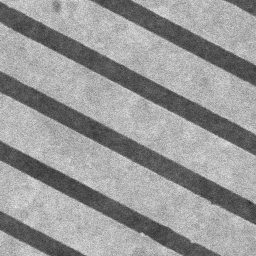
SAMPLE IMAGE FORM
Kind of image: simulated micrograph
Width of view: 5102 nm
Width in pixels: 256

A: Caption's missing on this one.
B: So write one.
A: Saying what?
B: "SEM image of one or a few lines or trenches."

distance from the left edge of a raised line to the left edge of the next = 1.23 um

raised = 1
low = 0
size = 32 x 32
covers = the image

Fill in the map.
01111111111100000111111111111000
00011111111111000001111111111110
00000111111111110000011111111111
10000001111111111100000111111111
11100000011111111111000001111111
11111000001111111111110000011111
11111110000011111111111100000111
11111111100000111111111110000001
11111111111000001111111111100000
01111111111110000011111111111000
00011111111111000000111111111110
00000111111111110000001111111111
11000001111111111100000011111111
11110000011111111111000000111111
11111100000111111111110000001111
11111110000001111111111100000011
11111111100000011111111111000000
11111111111000000111111111110000
00111111111110000001111111111100
00001111111111100000011111111111
10000011111111111000001111111111
11100000111111111110000011111111
11111000001111111111100000111111
11111100000011111111111000001111
11111111000001111111111110000011
11111111110000011111111111100000
11111111111100000111111111111000
00111111111111000001111111111110
00001111111111110000011111111111
10000011111111111100000111111111
11100000111111111111000001111111
11111000001111111111110000011111